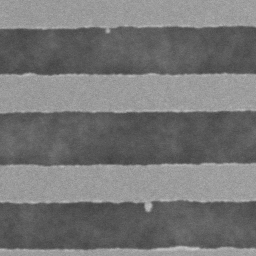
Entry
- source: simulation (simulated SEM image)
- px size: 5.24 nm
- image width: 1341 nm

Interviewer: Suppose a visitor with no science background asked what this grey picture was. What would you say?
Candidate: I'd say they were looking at lines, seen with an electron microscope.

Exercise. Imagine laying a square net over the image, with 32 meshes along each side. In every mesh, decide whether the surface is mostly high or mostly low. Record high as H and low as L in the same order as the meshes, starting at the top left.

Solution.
HHHHHHHHHHHHHHHHHHHHHHHHHHHHHHHH
HHHHHHHHHHHHHHHHHHHHHHHHHHHHHHHH
HHHHHHHHHHHHHHHHHHHHHHHHHHHHHHHH
HHHHHHHHHHLLLHLLLLLLLLLLLLLLLLLL
LLLLLLLLLLLLLLLLLLLLLLLLLLLLLLLL
LLLLLLLLLLLLLLLLLLLLLLLLLLLLLLLL
LLLLLLLLLLLLLLLLLLLLLLLLLLLLLLLL
LLLLLLLLLLLLLLLLLLLLLLLLLLLLLLLL
LLLLLLLLLLLLLLLLLLLLLLLLLLLLLLLL
HHHHHHHHHHHHHHHHHHHHHHHHHHHHHHHH
HHHHHHHHHHHHHHHHHHHHHHHHHHHHHHHH
HHHHHHHHHHHHHHHHHHHHHHHHHHHHHHHH
HHHHHHHHHHHHHHHHHHHHHHHHHHHHHHHH
HHHHHHHHHHHHHHHHHHHHHHHHHHHHHHHH
LLLLLLLLLLLLLLLLLLLLLLLLLLLLLLLL
LLLLLLLLLLLLLLLLLLLLLLLLLLLLLLLL
LLLLLLLLLLLLLLLLLLLLLLLLLLLLLLLL
LLLLLLLLLLLLLLLLLLLLLLLLLLLLLLLL
LLLLLLLLLLLLLLLLLLLLLLLLLLLLLLLL
LLLLLLLLLLLLLLLLLLLLLLLLLLLLLLLL
LLLLLLLLLLLLLLLLLLLLLLLLLHHHHHHH
HHHHHHHHHHHHHHHHHHHHHHHHHHHHHHHH
HHHHHHHHHHHHHHHHHHHHHHHHHHHHHHHH
HHHHHHHHHHHHHHHHHHHHHHHHHHHHHHHH
HHHHHHHHHHHHHHHHHHHHHHHHHHHHHHHH
LLLLLLLLLLLLLLLLLLLLLLLLLLLLLLLL
LLLLLLLLLLLLLLLLLLLLLLLLLLLLLLLL
LLLLLLLLLLLLLLLLLLLLLLLLLLLLLLLL
LLLLLLLLLLLLLLLLLLLLLLLLLLLLLLLL
LLLLLLLLLLLLLLLLLLLLLLLLLLLLLLLL
LLLLLLLLLLLLLLLLLLLLLLLLLLLLLLLL
HHHHHHHHHHHHHHHHHHHHHHHHHHHHHHHH